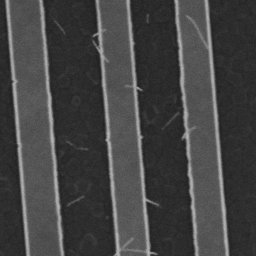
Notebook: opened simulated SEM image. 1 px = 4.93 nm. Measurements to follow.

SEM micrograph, one or a few lines or trenches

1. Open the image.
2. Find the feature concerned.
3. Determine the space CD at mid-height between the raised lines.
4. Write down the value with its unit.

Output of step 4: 251 nanometres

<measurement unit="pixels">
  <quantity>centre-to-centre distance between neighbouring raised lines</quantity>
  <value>83.3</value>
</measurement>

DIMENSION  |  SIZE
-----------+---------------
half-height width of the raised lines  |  154 nanometres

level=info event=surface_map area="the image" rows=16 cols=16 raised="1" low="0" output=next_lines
1110001100011000
0110001100011000
0110001100011000
0110001100011000
0110001100011000
0110000100011000
0110000110001000
0110000110001100
0110000110001100
0110000110001100
0110000110001100
0111000110001100
0111000110001100
0011000110001100
0011000110001100
0011000110001100